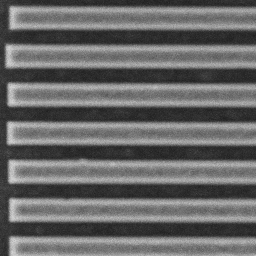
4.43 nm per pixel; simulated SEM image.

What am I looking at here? parallel lines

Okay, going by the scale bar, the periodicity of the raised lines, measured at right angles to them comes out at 170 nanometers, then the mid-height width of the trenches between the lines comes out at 78.1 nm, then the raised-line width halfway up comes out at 92.6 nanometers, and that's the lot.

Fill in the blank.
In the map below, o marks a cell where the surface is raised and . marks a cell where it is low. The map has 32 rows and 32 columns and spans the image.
................................
.ooooooooooooooooooooooooooooooo
.ooooooooooooooooooooooooooooooo
....oooooooo............oooooooo
................................
................................
.ooooooooooooooooooooooooooooooo
.ooooooooooooooooooooooooooooooo
................................
................................
................................
.ooooooooooooooooooooooooooooooo
.ooooooooooooooooooooooooooooooo
................................
................................
.ooooooooooooooooooo.ooooooooooo
.ooooooooooooooooooooooooooooooo
.ooooooooooooooooooooooooooooooo
................................
................................
.ooooooooooooooooooooooooooooooo
.ooooooooooooooooooooooooooooooo
.ooooooooooooooooooooooooooooooo
................................
................................
.ooooooooooooooooooooooooooooooo
.ooooooooooooooooooooooooooooooo
......oooooooooooooooooooooooooo
................................
................................
.ooooooooooooooooooooooooooooooo
.ooooooooooooooooooooooooooooooo